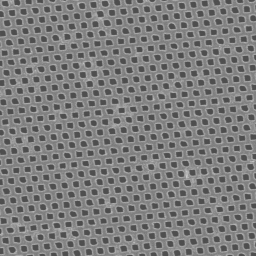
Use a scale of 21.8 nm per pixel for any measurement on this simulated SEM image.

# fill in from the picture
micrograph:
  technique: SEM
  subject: a regular array of holes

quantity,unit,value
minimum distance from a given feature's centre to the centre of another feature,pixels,11.2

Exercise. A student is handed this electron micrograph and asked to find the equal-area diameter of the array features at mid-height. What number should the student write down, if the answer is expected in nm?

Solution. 147